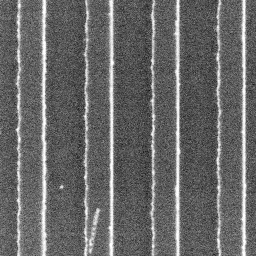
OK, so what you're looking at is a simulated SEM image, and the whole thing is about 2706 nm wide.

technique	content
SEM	lines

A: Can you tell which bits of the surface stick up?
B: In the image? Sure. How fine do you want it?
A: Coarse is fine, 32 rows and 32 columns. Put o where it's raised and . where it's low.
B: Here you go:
..oooo.....ooo.....ooo.....oooo.
..oooo.....ooo.....ooo.....oooo.
..oooo.....ooo.....ooo.....oooo.
..oooo.....ooo.....ooo.....ooo..
..oooo.....ooo.....ooo.....ooo..
..oooo.....ooo.....ooo.....oooo.
..oooo.....ooo.....ooo.....ooo..
..oooo.....ooo.....ooo.....oooo.
..oooo.....ooo.....ooo.....oooo.
..oooo.....ooo.....ooo.....oooo.
..oooo.....ooo.....ooo.....oooo.
..oooo.....ooo.....ooo.....oooo.
..oooo.....ooo.....ooo.....oooo.
..oooo.....ooo.....ooo.....oooo.
..oooo.....ooo.....ooo.....oooo.
..oooo.....ooo.....ooo.....oooo.
..oooo.....ooo.....ooo.....oooo.
..oooo.....ooo.....ooo.....oooo.
..oooo.....ooo.....ooo.....oooo.
..oooo.....ooo.....ooo.....oooo.
..oooo.....ooo.....ooo.....oooo.
..oooo.....ooo.....ooo.....oooo.
..oooo.....ooo.....ooo.....oooo.
..oooo.....ooo.....ooo.....oooo.
..oooo.....ooo.....ooo.....oooo.
..oooo.....ooo.....ooo.....oooo.
..oooo.....ooo.....ooo.....oooo.
..oooo.....ooo.....ooo.....oooo.
..ooo......ooo.....ooo.....oooo.
..oooo.....ooo.....ooo.....oooo.
..oooo.....ooo.....ooo.....oooo.
..oooo.....ooo.....ooo.....oooo.